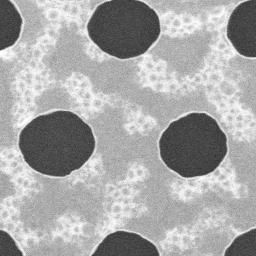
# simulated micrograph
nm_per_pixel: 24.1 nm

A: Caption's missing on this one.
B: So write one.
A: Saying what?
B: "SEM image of holes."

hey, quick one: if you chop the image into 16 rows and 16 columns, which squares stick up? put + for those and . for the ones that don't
.+++++...++++++.
.++++.....++++..
.+++++....++++..
+++++++..++++++.
++++++++++++++++
++++++++++++++++
++++++++++++++++
++...++++++..+++
+.....++++....++
+.....++++....++
++...++++++...++
++++++++++++++++
++++++++++++++++
++++++++++++++++
+++++++.+++++++.
.+++++....++++..